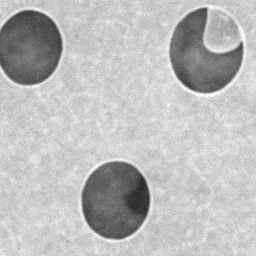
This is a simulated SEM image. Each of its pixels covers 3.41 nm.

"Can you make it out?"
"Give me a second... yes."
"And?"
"holes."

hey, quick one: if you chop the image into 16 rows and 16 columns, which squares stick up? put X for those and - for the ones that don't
XXXXXXXXXXXXXXXX
----XXXXXXX----X
----XXXXXXX----X
----XXXXXXX----X
---XXXXXXXX----X
XXXXXXXXXXXX--XX
XXXXXXXXXXXXXXXX
XXXXXXXXXXXXXXXX
XXXXXXXXXXXXXXXX
XXXXXXXXXXXXXXXX
XXXXXX---XXXXXXX
XXXXX----XXXXXXX
XXXXX----XXXXXXX
XXXXX----XXXXXXX
XXXXXX--XXXXXXXX
XXXXXXXXXXXXXXXX